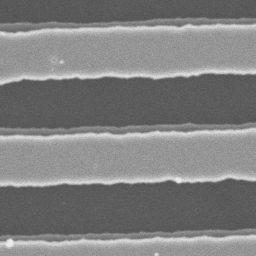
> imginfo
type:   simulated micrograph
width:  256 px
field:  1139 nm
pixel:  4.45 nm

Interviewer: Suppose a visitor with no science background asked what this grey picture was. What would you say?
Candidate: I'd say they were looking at lines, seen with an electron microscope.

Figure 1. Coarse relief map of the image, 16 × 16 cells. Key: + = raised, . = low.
................
++++++++++++++++
++++++++++++++++
++++++++++++++++
++++++++++++++++
................
................
................
++++++++++++++++
++++++++++++++++
++++++++++++++++
+++++++.........
................
................
...........+++++
++++++++++++++++